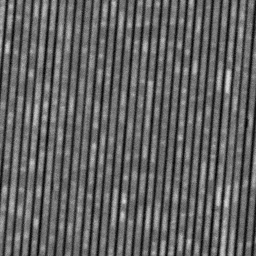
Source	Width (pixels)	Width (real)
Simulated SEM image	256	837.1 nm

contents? parallel lines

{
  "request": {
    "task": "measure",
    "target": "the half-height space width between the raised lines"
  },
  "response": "9 nm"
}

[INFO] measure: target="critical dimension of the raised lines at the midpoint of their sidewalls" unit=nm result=18.4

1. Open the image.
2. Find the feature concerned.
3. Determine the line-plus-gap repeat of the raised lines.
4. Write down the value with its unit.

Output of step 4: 28 nm